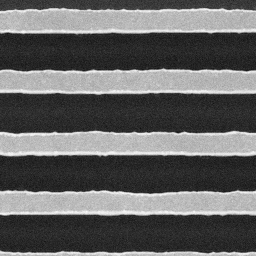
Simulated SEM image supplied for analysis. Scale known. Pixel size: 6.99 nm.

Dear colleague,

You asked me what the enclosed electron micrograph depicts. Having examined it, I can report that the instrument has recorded lines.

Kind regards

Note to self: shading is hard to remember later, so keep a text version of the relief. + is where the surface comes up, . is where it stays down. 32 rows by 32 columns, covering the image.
................................
++++++++++++++++++++++++++++++++
++++++++++++++++++++++++++++++++
++++++++++++++++++++++++++++++++
................................
................................
................................
................................
................................
++++++++++++++++++++++++++++++++
++++++++++++++++++++++++++++++++
++++++++++++++++++++++++++++++++
................................
................................
................................
................................
...........++................+..
++++++++++++++++++++++++++++++++
++++++++++++++++++++++++++++++++
................................
................................
................................
................................
................................
++++++++++++++++++++++++++++++++
++++++++++++++++++++++++++++++++
++++++++++++++++++++++++++++++++
................................
................................
................................
................................
+...............................